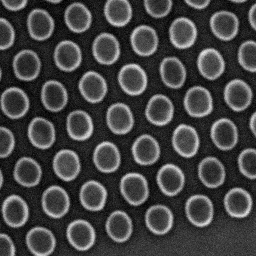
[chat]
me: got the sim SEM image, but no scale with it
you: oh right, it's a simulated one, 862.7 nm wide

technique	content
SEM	a regular array of raised bodies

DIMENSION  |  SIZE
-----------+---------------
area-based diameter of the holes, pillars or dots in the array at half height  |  93.5 nm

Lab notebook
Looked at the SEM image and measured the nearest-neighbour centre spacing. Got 132 nanometres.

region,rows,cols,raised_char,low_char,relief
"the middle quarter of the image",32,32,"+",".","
+++.............++......++++++..
++.............++++.....++++++..
......++......++++++....++++++..
.....++++.....++++++.....+++++..
....++++++....++++++.....+++++..
....++++++....++++++.......++...
....+++++++....+++++...........+
.....+++++.....................+
+....++++.............++++....++
.....................++++++...++
............+++......++++++...++
...........+++++.....++++++....+
..++++.....++++++....++++++....+
.+++++.....++++++....++++++.....
.++++++....++++++.....++++......
.++++++....++++++...............
.++++++.....++++............++++
.++++++.....................++++
..++++.............+++.....+++++
..................+++++....+++++
.........++++....+++++++....++++
........+++++....+++++++....++++
+++.....++++++....++++++.....+++
+++....+++++++....+++++.........
++++....++++++.....+++..........
++++....++++++............+.....
++++.....+++............+++++...
+++.....................+++++...
++.............+++++...+++++++..
......+.......++++++....++++++..
.....++++.....+++++++...++++++..
....++++++....+++++++....++++...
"